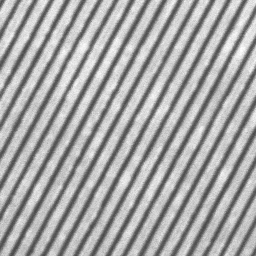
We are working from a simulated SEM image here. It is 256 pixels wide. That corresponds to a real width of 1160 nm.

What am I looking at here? parallel lines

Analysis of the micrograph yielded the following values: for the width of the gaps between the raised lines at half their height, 24.9 nm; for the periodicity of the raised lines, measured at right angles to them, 64.4 nanometers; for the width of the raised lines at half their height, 41.4 nm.